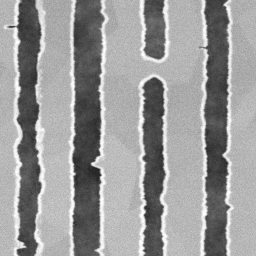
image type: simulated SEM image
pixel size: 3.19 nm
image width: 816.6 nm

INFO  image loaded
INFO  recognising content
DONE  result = one or a few lines or trenches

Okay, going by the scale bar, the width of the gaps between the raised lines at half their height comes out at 78.2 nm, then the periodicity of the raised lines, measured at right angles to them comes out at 205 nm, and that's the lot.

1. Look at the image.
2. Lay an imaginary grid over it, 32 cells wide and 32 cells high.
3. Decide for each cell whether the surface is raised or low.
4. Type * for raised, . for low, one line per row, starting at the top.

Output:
**...****....*****...****...****
**...****....*****...****....***
**...****....*****...*****...***
**...****....*****...*****...***
**...****....*****...*****...***
**...****....*****...*****...***
**...****....*****...*****...***
**...****....******.******...***
**...****....*************...***
**...****....*************...***
**...****....*****...****....***
**...****....*****...*****...***
**...****....*****...****....***
**...****....*****...****....***
**...****....*****...****....***
**...****....*****...*****...***
**...****....*****...****....***
**...****....*****...****....***
**...****....*****...*****...***
**...****...******...*****..****
**...****...******...*****...***
**...****....*****...*****...***
**...****....*****...****...****
**...****....*****...****...****
**...****....*****..******..****
**...****....*****...*****...***
**...****....*****...*****...***
**...****....*****..*****....***
**...****....*****..*****...****
**..*****....*****...****...****
***..****....*****...****....***
**...****....*****...****....***